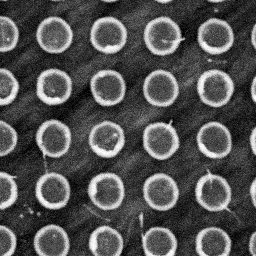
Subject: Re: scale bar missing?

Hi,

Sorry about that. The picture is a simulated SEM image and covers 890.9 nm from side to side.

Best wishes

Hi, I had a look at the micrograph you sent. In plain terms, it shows a regular array of raised bodies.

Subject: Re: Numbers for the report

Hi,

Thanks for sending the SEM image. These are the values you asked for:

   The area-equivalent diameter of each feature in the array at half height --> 117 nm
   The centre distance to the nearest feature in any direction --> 51.6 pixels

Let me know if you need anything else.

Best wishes